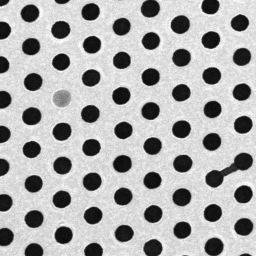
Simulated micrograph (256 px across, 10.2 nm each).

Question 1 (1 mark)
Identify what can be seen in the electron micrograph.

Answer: a regular array of holes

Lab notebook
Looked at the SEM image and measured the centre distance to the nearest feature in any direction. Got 340 nm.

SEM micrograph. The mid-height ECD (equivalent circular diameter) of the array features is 18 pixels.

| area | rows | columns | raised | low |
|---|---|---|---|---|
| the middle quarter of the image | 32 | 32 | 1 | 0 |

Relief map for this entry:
01111111111110001111111111110011
11111100111111111111000111111111
11111000011111111111000011111111
11110000011111111110000011111111
11111000011111111111000111111111
11111000111111111111111111110001
11111111111110001111111111100000
11111111111100000111111111100000
11111111111100001111111111100001
11111111111110001111111111111111
11111000111111111111000011111111
11111000011111111110000011111111
11110000011111111110000011111111
11111000011111111111000111111111
11111000111111001111111111110001
00111111111110000111111111100000
00111111111100000111111111100000
00111111111110000111111111100001
01111111111111001111100111111011
11111000011111111111000011111111
11111000011111111111000011111111
11111000011111111111000011111111
11111000111111111111100111111111
01111111111110001111111111110000
00111111111100000111111111100000
00111111111100000111111111100000
00111111111110001111111111110001
11111100011111111111100011111111
11111000011111111111000011111111
11111000011111111111000011111111
11111000011111111111000011111111
11111100111110001111111111110001